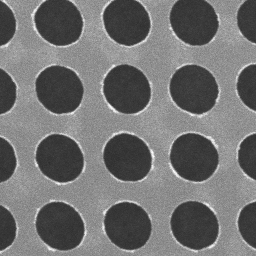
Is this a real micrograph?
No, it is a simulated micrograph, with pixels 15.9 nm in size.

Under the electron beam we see a regular array of holes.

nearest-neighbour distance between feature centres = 1070 nanometres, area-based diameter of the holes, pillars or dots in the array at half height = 0.773 um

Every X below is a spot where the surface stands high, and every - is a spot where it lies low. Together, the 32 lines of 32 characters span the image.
-XXXX----XXXXX----XXXX----XXXX--
--XX------XXX-----XXX------XXX--
--XX------XXX------XX------XXX--
--XXX-----XXX------XXX-----XXX--
--XXX-----XXXX----XXXX-----XXX--
-XXXXX---XXXXXX--XXXXXX---XXXXXX
XXXXXXXXXXXXXXXXXXXXXXXXXXXXXXXX
XXXXXXXXXXXXXXXXXXXXXXXXXXXXXXXX
XXXXXX---XXXXX---XXXXX----XXXXX-
-XXXX-----XXX-----XXXX-----XXX--
--XX------XXX------XX------XXX--
--XX------XXX------XX------XXX--
--XXX-----XXX------XXX-----XXX--
-XXXXX----XXXX----XXXXX----XXXX-
XXXXXXXXXXXXXXXXXXXXXXXXXXXXXXXX
XXXXXXXXXXXXXXXXXXXXXXXXXXXXXXXX
XXXXXXXXXXXXXXXXXXXXXXXXXXXXXXXX
-XXXX----XXXXX----XXXX----XXXX--
--XXX-----XXX------XX------XXX--
--XX------XXX------XX------XXX--
--XXX-----XXX------XX------XXX--
--XXX-----XXXX-----XXX-----XXX--
-XXXXX---XXXXXX--XXXXXX---XXXXXX
XXXXXXXXXXXXXXXXXXXXXXXXXXXXXXXX
XXXXXXXXXXXXXXXXXXXXXXXXXXXXXXXX
XXXXXX--XXXXXX---XXXXXX---XXXXX-
-XXXX-----XXX-----XXXX-----XXX--
--XX------XXX------XX------XXX--
--XX-------XX------XX------XXX--
--XXX------XX------XXX-----XXX--
-XXXXX----XXXX----XXXX-----XXXX-
XXXXXXXXXXXXXXXXXXXXXXXXXXXXXXXX